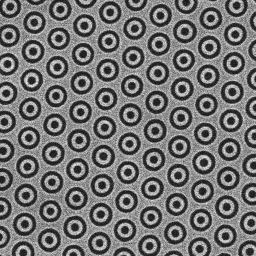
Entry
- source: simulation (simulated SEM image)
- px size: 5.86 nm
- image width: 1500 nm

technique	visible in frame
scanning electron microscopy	a regular array of ring-shaped grooves with a dot in the middle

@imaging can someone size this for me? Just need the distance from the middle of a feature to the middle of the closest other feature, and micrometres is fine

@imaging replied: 0.167